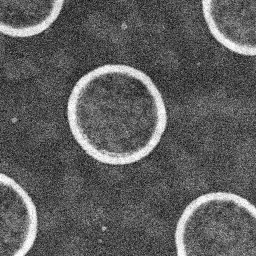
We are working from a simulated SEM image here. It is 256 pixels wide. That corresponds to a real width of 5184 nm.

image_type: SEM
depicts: raised bodies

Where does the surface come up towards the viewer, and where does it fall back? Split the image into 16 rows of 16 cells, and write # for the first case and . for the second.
####.........###
###..........###
..............##
................
......##........
.....#####......
.....#####......
.....#####......
.....#####......
......###.......
................
#...............
##...........##.
##..........####
##.........#####
##.........#####